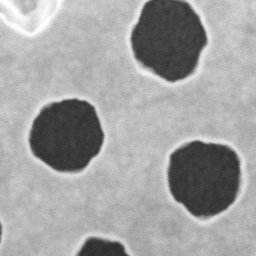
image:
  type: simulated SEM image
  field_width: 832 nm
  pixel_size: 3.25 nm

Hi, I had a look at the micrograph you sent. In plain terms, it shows holes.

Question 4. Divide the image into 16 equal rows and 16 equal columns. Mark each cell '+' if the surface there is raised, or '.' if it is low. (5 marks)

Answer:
+++++++++...++++
++++++++.....+++
++++++++.....+++
++++++++.....+++
+++++++++...++++
++++++++++++++++
+++...++++++++++
++....++++++++++
++....++++++++++
++....+++++....+
+++..++++++....+
+++++++++++....+
+++++++++++....+
++++++++++++.+++
++++++++++++++++
+++++...++++++++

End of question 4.